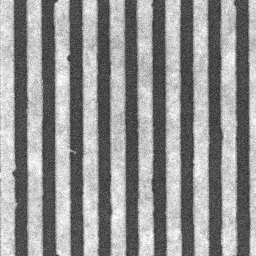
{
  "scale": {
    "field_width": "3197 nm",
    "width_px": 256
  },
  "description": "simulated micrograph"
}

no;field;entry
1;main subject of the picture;parallel lines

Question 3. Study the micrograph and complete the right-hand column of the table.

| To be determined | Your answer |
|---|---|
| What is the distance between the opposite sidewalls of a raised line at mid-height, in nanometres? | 167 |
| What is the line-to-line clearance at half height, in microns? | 0.181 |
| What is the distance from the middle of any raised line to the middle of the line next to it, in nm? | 346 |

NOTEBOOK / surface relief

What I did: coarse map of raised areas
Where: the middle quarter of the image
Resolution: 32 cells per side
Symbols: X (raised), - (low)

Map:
X----XXX----XXX----XXX----XXX---
X----XXX----XXX----XXX----XXX---
X----XXX----XXX----XXX----XXX---
X----XXX----XXX----XXX----XXX---
X----XXX----XXX----XXX----XXX---
X----XXX----XXX----XXX----XXX---
X----XXX----XXX----XXX----XXX---
X----XXX----XXX----XXX----XXX---
X----XXX----XXX----XXX----XXX---
X----XXX----XXX----XXX----XXX---
X----XXX----XXX----XXX----XXX---
X----XXX----XXX----XXX----XXX---
X----XXX----XXX----XXX----XXX---
X----XXX----XXX----XXX----XXX---
X----XXX----XXX----XXX----XXX---
X----XXX----XXX----XXX----XXX---
X----XXX----XXX----XXX----XXX---
X----XXX----XXX----XXX----XXX---
X----XXX----XXX----XXX----XXX---
X----XXX----XXX----XXX----XXX---
X----XXX----XXX----XXX----XXX---
XX---XXX----XXX----XXX----XXX---
X----XXX----XXX----XXX----XXX---
X----XXX----XXX----XXX----XXX---
X----XXX----XXX----XXX----XXX---
X----XXX----XXX----XXX----XXX---
X----XXX----XXX----XXX----XXX---
X----XXX----XXX----XXX----XXX---
X----XXX----XXX----XXX----XXX---
X----XXX----XXX----XXX----XXX---
X----XXX----XXX----XX-----XXX---
X----XXX----XXX----XXX----XXX---